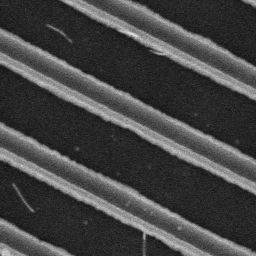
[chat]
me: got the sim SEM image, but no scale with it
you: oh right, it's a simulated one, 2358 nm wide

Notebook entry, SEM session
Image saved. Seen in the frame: lines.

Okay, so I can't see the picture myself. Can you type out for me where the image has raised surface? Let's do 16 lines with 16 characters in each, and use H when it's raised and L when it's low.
LLLLLHHHHLLLLLLL
LLLLLLLHHHHLLLLL
HLLLLLLLLHHHHLLL
HHHLLLLLLLLHHHLL
LHHHHLLLLLLLLHHH
LLLHHHHLLLLLLLLH
LLLLLHHHHLLLLLLL
LLLLLLLHHHHLLLLL
HLLLLLLLLHHHHLLL
HHHLLLLLLLLHHHHL
LHHHHLLLLLLLLHHH
LLLHHHHLLLLLLLLH
LLLLLHHHHLLLLLLL
LLLLLLLHHHHLLLLL
HLLLLLLLLHHHHLLL
HHHLLLLLLLLHHHHL